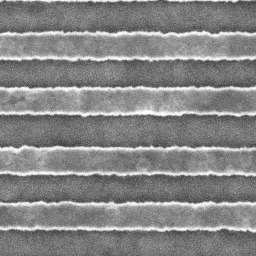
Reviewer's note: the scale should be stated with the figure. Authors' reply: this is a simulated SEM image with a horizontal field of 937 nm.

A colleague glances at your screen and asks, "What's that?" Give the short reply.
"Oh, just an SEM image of lines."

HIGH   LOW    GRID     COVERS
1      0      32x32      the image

00000000000000000000000000000000
00000000000000000000000000000000
00000000000000000000000000000000
00000000000000000000000000000000
11111111111111111111111111111111
11111111111111111111111111111111
11111111111111111111111111111111
00000000000010000000000000000000
00000000000000000000000000000000
00000000000000000000000000000000
00000000000000000000000000000000
11111111111111111111111111111111
11111111111111111111111111111111
11111111111111111111111111111111
00000000000000000000000000000000
00000000000000000000000000000000
00000000000000000000000000000000
00000000000000000000000000000000
00010001001100000111011101100000
11111111111111111111111111111111
11111111111111111111111111111111
11111111111111111111111111111111
00000000000000000000000000000000
00000000000000000000000000000000
00000000000000000000000000000000
11111111111111011111111101111111
11111111111111111111111111111111
11111111111111111111111111111111
10111111111111111111111111111111
00000000000000000000000000000000
00000000000000000000000000000000
00000000000000000000000000000000